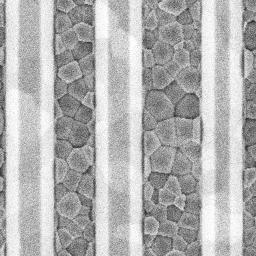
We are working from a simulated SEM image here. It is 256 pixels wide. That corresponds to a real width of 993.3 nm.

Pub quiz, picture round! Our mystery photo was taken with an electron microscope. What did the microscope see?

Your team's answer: one or a few lines or trenches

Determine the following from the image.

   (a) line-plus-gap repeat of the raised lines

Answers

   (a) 0.372 um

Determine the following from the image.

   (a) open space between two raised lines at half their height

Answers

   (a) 240 nm